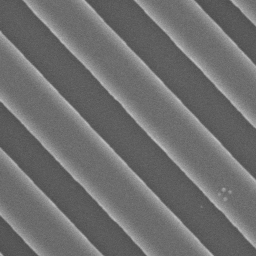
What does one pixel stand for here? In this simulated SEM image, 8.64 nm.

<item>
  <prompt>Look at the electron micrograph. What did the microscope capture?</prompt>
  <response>lines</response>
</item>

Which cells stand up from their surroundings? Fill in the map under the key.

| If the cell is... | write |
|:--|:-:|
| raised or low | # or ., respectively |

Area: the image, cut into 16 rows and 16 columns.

..####...####..#
...####...####..
#...####...###..
#....####...###.
##....####...###
###....###....##
####....###....#
.####...####...#
..####...####...
...####...####..
#...####...####.
##...####...####
###...####...###
####...####...##
.####...####...#
..####...####...